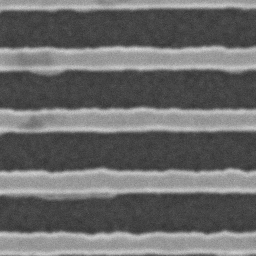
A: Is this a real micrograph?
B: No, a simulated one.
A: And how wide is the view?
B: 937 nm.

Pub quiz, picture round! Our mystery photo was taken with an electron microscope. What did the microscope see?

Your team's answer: lines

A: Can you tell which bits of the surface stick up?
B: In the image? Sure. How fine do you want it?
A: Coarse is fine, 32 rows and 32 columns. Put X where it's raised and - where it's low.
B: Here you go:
XXXXXXXXXXXXXXXXXXXXXXXXXXXXXXXX
--------------------------------
--------------------------------
--------------------------------
--------------------------------
--------------------------------
XXXXXXXXXXXXXXXXXXXXXXXXXXXXXXXX
XXXXXXXXXXXXXXXXXXXXXXXXXXXXXXXX
XXXXXXXXXXXXXXXXXXXXXXXXXXXXXXXX
--------------------------------
--------------------------------
--------------------------------
--------------------------------
-----------------X--------------
XXXXXXXXXXXXXXXXXXXXXXXXXXXXXXXX
XXXXXXXXXXXXXXXXXXXXXXXXXXXXXXXX
--XXXX------XXX-----------------
--------------------------------
--------------------------------
--------------------------------
--------------------------------
XXXXXX--XXXXXXXXXXXXXXXX-XXXXXXX
XXXXXXXXXXXXXXXXXXXXXXXXXXXXXXXX
XXXXXXXXXXXXXXXXXXXXXXXXXXXXXXXX
--------------------------------
--------------------------------
--------------------------------
--------------------------------
--------------------------------
XXXXXXXXXXXXXXXXXXXXXXXXXXXXXXXX
XXXXXXXXXXXXXXXXXXXXXXXXXXXXXXXX
XXXXXXXXXXXXXXXXXXXXXXXXXXXXXXXX